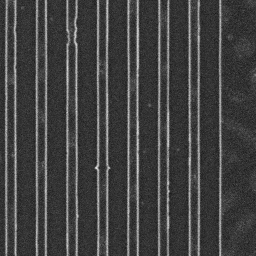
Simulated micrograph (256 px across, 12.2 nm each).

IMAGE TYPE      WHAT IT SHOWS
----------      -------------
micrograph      parallel lines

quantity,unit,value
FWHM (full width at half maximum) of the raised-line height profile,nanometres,124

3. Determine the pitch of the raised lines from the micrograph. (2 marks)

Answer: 30.6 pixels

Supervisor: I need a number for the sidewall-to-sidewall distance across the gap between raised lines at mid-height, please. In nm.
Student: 259